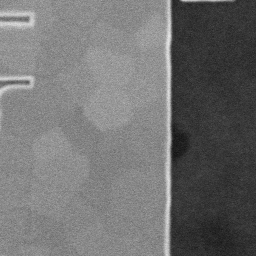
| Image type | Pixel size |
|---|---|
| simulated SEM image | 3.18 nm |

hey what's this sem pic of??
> wiring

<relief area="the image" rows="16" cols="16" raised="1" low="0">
1111111111100000
1111111111100000
1111111111100000
1111111111100000
1111111111100000
1111111111100000
1111111111100000
1111111111100000
1111111111100000
1111111111100000
1111111111100000
1111111111100000
1111111111100000
1111111111100000
1111111111000000
1111111111000000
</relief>